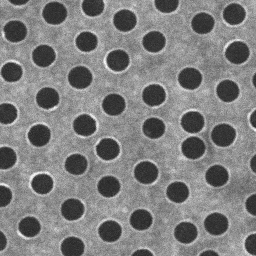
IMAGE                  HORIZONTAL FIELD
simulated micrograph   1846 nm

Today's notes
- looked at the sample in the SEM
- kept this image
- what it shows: a regular array of holes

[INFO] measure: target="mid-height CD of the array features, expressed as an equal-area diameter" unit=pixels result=23.7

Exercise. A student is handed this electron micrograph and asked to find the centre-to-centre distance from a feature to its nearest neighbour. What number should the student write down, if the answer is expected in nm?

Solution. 264